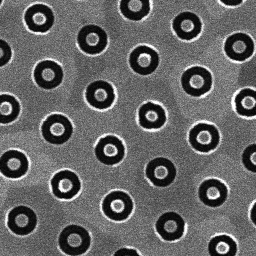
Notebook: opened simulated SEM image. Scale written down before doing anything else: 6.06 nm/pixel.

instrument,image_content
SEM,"a regular array of ring-shaped grooves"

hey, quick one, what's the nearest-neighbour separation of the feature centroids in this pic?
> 0.335 um